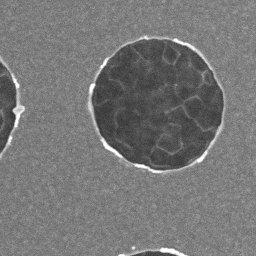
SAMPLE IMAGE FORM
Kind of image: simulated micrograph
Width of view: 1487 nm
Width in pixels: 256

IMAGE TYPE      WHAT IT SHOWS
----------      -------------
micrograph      holes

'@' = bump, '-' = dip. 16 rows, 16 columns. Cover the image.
@@@@@@@@@@@@@@@@
@@@@@@@@@@@@@@@@
@@@@@@@@@-@@@@@@
@@@@@@@-----@@@@
-@@@@@-------@@@
-@@@@@--------@@
-@@@@@--------@@
-@@@@@--------@@
-@@@@@-------@@@
@@@@@@@------@@@
@@@@@@@@@--@@@@@
@@@@@@@@@@@@@@@@
@@@@@@@@@@@@@@@@
@@@@@@@@@@@@@@@@
@@@@@@@@@@@@@@@@
@@@@@@@@@@@@@@@@